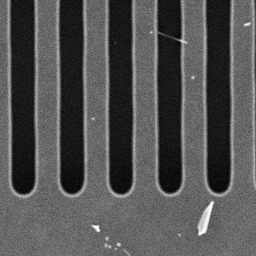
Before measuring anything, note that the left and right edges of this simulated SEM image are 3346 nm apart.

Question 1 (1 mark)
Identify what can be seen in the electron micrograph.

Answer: groups of lines, slits or small figures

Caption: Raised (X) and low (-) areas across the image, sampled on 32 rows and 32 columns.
X---XXX---XXX----XXX---XXX---XXX
X---XXX---XXX----XXX---XXX---XXX
X---XXX---XXX----XXX---XXX---XXX
X---XXX----XX----XXX---XXX---XXX
X---XXX----XX----XXX---XXX---XXX
X---XXX----XX----XXX---XXX---XXX
X---XXX----XX----XXX---XXX---XXX
X---XXX---XXXX---XXX---XXX---XXX
X---XXX---XXXX---XXX---XXX---XXX
X---XXX---XXXX---XXX---XXX---XXX
X---XXX---XXXX---XXX---XXX---XXX
X---XXX----XXX---XXX---XXX---XXX
X---XXX----XXX---XXX---XXX---XXX
X---XXX----XX----XXX---XXX---XXX
X---XXX----XXX---XXX---XXX---XXX
X---XXX----XXX---XXX---XXX---XXX
X---XXX----XXX---XXX---XXX---XXX
X----XX----XXX---XXX---XXX---XXX
X----XX----XXX---XXX---XXX---XXX
X----XX----XXX---XXX---XXX---XXX
X----XX----XXX---XXX---XXX---XXX
X----XX----XXX---XXX---XXX---XXX
X---XXXX--XXXX---XXX---XXX---XXX
XX--XXXX--XXXX--XXXX--XXXX---XXX
XXXXXXXXXXXXXXXXXXXXXXXXXXXXXXXX
XXXXXXXXXXXXXXXXXXXXXXXXXXXXXXXX
XXXXXXXXXXXXXXXXXXXXXXXXXXXXXXXX
XXXXXXXXXXXXXXXXXXXXXXXXXXXXXXXX
XXXXXXXXXXXXXXXXXXXXXXXXXXXXXXXX
XXXXXXXXXXXXXXXXXXXXXXXXXXXXXXXX
XXXXXXXXXXXXXXXXXXXXXXXXXXXXXXXX
XXXXXXXXXXXXXXXXXXXXXXXXXXXXXXXX